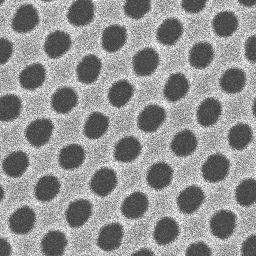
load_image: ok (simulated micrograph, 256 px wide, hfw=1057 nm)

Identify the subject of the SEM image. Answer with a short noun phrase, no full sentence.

a regular array of holes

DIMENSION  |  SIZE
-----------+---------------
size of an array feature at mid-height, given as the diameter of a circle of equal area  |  0.11 um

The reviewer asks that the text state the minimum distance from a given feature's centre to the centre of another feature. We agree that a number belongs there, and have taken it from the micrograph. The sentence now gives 0.163 um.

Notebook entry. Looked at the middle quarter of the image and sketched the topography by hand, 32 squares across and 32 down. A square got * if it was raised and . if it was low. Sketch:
***......********......*********
***......********......*********
***......*********....*****...**
***.....******************.....*
****...******...**********.....*
************.....********......*
...********......********......*
...********......********......*
...********......*********....**
...********.....***********.****
...*********...******...********
..******************.....*******
*******...*********......*******
******.....********......*******
*****......*******.......*******
*****......********.....********
*****......********....*******.*
*****.....******************....
******...******...*********.....
*************......********.....
*...*********......********.....
.....********......********.....
.....*******.......*********....
.....********.....**************
.....*********..****************
....******************.....*****
*********...*********......*****
*******......********......*****
*******......********......*****
******.......********......*****
*******......*********....*****.
*******.....******************..